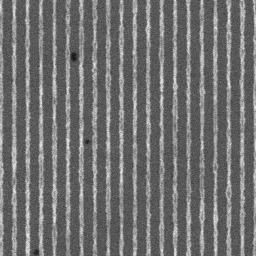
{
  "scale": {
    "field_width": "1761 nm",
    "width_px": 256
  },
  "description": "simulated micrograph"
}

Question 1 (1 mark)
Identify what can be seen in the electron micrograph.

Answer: parallel lines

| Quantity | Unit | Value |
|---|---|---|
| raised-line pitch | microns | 0.0924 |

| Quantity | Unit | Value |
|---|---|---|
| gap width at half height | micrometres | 0.0757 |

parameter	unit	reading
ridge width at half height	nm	18.9